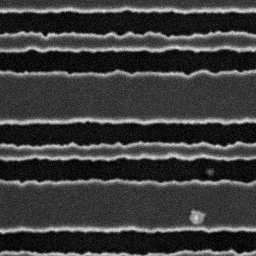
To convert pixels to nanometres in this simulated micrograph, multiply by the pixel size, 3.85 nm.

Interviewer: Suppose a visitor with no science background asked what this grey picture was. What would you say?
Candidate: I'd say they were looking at lines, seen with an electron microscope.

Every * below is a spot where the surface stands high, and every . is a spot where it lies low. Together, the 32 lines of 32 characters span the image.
********************************
*.*.**....**.*....*...***..*..**
................................
................................
*********************...********
********************************
................................
................................
................................
********************************
********************************
********************************
********************************
********************************
********************************
..*.........................*...
................................
................................
********************************
********************************
................................
................................
...........*..*.................
********************************
********************************
********************************
********************************
********************************
********************************
................................
................................
****..................********.*